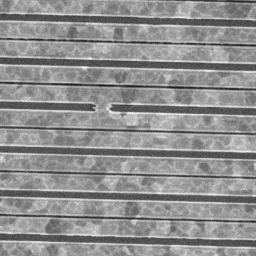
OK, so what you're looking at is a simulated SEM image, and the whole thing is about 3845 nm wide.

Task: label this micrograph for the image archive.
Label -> parallel lines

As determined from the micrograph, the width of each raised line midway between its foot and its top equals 236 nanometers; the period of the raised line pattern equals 328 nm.